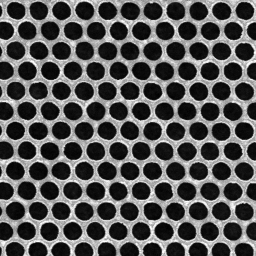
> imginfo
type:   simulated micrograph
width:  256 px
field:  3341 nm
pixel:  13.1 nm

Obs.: a regular array of holes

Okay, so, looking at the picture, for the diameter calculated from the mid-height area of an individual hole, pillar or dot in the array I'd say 0.245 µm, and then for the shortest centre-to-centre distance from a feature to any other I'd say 296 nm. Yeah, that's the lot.